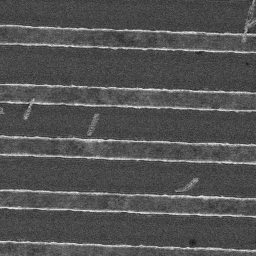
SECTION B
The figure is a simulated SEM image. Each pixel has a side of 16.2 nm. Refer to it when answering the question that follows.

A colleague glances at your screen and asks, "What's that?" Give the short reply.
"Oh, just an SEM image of lines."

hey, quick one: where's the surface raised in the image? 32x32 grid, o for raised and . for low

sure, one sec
................................
................................
................................
oooooooo........................
oooooooooooooooooooooooooooooooo
...ooooooooooooooooooooooooooooo
.............................ooo
................................
................................
................................
................................
oooooooooooooooooooooooooooo....
oooooooooooooooooooooooooooooooo
.....................ooooooooooo
................................
................................
................................
oooooooooooooo..................
oooooooooooooooooooooooooooooooo
....oooooooooooooooooooooooooooo
................................
................................
................................
................................
ooooooooooooooooooooo...........
oooooooooooooooooooooooooooooooo
...............ooooooooooooooooo
................................
................................
................................
oooooooooo......................
oooooooooooooooooooooooooooooooo